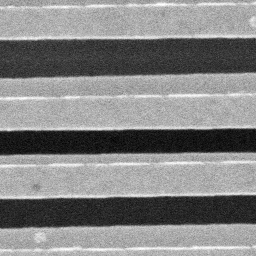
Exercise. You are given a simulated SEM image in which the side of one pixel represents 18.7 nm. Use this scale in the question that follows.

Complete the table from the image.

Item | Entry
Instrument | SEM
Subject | lines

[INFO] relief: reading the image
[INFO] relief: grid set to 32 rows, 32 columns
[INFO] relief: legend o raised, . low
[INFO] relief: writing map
oooooooooooooooooooooooooooooooo
oooooooooooooooooooooooooooooooo
oooooooooooooooooooooooooooooooo
oooooooooooooooooooooooooooooooo
oooooooooooooooooooooooooooooooo
................................
................................
................................
................................
....................oooooooooooo
oooooooooooooooooooooooooooooooo
oooooooooooooooooooooooooooooooo
oooooooooooooooooooooooooooooooo
oooooooooooooooooooooooooooooooo
oooooooooooooooooooooooooooooooo
oooooooooooooooooooooooooooooooo
................................
................................
................................
.ooooooooooooooooooooooooooooooo
oooooooooooooooooooooooooooooooo
oooooooooooooooooooooooooooooooo
oooooooooooooooooooooooooooooooo
oooooooooooooooooooooooooooooooo
oooooooooooooooooooo............
................................
................................
................................
.......ooooooooooooooooooooooooo
oooooooooooooooooooooooooooooooo
oooooooooooooooooooooooooooooooo
oooooooooooooooooooooooooooooooo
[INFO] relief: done